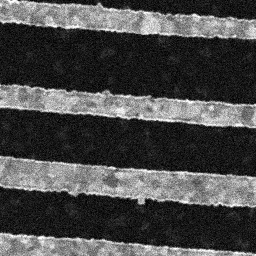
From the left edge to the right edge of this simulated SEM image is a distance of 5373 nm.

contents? one or a few lines or trenches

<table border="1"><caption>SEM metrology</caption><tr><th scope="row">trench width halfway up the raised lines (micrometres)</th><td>1.06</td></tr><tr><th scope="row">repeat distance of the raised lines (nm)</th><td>1690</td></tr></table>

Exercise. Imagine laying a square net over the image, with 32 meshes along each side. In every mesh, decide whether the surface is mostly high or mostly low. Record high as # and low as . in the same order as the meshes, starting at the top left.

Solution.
######..........................
##################..............
##############################..
..........######################
.......................#########
................................
................................
................................
................................
................................
................................
########.....#..................
######################..........
..##############################
.............###################
.........................#######
................................
................................
................................
................................
#########.......................
####################............
################################
...#############################
..............##################
.........................#######
................................
................................
................................
####............................
################................
#############################...